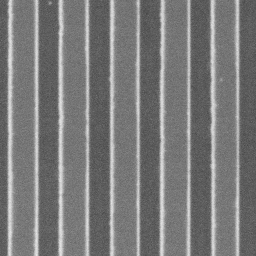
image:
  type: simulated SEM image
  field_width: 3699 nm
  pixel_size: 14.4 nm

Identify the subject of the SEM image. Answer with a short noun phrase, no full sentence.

lines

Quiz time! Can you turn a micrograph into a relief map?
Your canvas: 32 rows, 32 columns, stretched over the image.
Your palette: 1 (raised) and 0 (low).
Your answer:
01111000111000111000111100011100
01111000111000111000111100011100
01111000111000111000111100011100
01111000111000111000111100011100
01111000111000111000111100011100
01111000111000111000111100011100
01111000111000111000111100011100
01111000111000111000111100011100
01111000111000111000111100011100
01111000111000111000111100011100
01111000111000111000111100011100
01111000111000111000111100011100
01111000111000111000111100011100
01111000111000111000111100011100
01111000111000111000111100011100
01111000111000111000111100011100
01111000111000111000111100011100
01111000111000111000111100011100
01111000111000111000111100011100
01111000111000111000111100011100
01111000111000111000111100011100
01111000111000111000111100011100
01111000111000111000111100011100
01111000111000111000111100011100
01111000111000111000111100011100
01111000111000111000111100011100
01111000111000111000111100011100
01111000111000111000111100011100
01111000111000111000111100011100
01111000111000111000111100011100
01111000111000111000111100011100
01111000111000111000111100011100